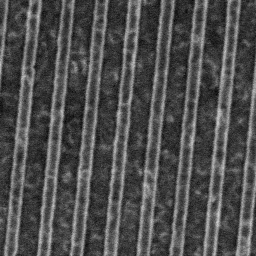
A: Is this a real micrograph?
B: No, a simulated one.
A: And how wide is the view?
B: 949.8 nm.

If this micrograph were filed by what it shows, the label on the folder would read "parallel lines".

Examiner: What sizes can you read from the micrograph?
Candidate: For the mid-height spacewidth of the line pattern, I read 0.0775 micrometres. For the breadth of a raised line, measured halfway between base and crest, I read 12.2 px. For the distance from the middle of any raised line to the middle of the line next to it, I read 123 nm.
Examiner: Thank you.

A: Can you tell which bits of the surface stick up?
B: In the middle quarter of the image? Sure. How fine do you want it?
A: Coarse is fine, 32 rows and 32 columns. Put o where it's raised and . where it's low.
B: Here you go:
o.....ooo......ooo.....ooo.....o
o.....ooo......oo......ooo.....o
o.....ooo.....ooo......ooo.....o
o.....ooo.....ooo......ooo.....o
o.....ooo.....ooo......oo......o
......ooo.....ooo.....ooo......o
......ooo.....ooo.....ooo......o
......ooo.....ooo.....ooo......o
......oo......ooo.....ooo.....oo
......oo......ooo.....ooo.....oo
.....ooo......ooo.....ooo.....oo
.....ooo......oo......ooo.....oo
.....ooo.....ooo......ooo.....oo
.....ooo.....ooo.....oooo.....oo
.....ooo.....ooo.....ooo......oo
.....ooo.....ooo.....ooo......oo
.....ooo.....ooo.....ooo......oo
.....ooo.....ooo.....ooo......oo
.....oo......ooo.....ooo.....ooo
.....oo......ooo.....ooo.....ooo
....ooo......ooo.....ooo.....ooo
....ooo......oo......ooo.....ooo
....ooo.....ooo......ooo.....ooo
....ooo.....ooo.....oooo.....ooo
....ooo.....ooo.....ooo......ooo
....ooo.....ooo.....ooo......ooo
....ooo.....ooo.....ooo......ooo
....ooo.....ooo.....ooo......oo.
....oo......ooo.....ooo.....ooo.
....oo......ooo.....ooo.....ooo.
...ooo......ooo.....ooo.....ooo.
...ooo......oo......ooo.....ooo.